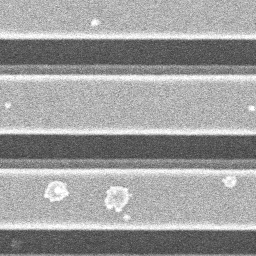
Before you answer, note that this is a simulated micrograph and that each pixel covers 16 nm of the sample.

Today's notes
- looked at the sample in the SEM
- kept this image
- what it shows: lines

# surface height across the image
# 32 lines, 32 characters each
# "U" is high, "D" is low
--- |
UUUUUUUUUUUUUUUUUUUUUUUUUUUUUUUU
UUUUUUUUUUUUUUUUUUUUUUUUUUUUUUUU
UUUUUUUUUUUUUUUUUUUUUUUUUUUUUUUU
UUUUUUUUUUUUUUUUUUUUUUUUUUUUUUUU
UUUUUUUUUUUUUUUUUUUUUUUUUUUUUUUU
DDDDDDDDDDDDDDDDDDDDDDDDDDDDDDDD
DDDDDDDDDDDDDDDDDDDDDDDDDDDDDDDD
DDDDDDDDDDDDDDDDDDDDDDDDDDDDDDDD
UUUUUUUUUUUUUUUUUUUUUUUUUUUUUUUU
UUUUUUUUUUUUUUUUUUUUUUUUUUUUUUUU
UUUUUUUUUUUUUUUUUUUUUUUUUUUUUUUU
UUUUUUUUUUUUUUUUUUUUUUUUUUUUUUUU
UUUUUUUUUUUUUUUUUUUUUUUUUUUUUUUU
UUUUUUUUUUUUUUUUUUUUUUUUUUUUUUUU
UUUUUUUUUUUUUUUUUUUUUUUUUUUUUUUU
UUUUUUUUUUUUUUUUUUUUUUUUUUUUUUUU
UUUUUUUUUUUUUUUUUUUUUUUUUUUUUUUU
DDDDDDDDDDDDDDDDDDDDDDDDDDDDDDDD
DDDDDDDDDDDDDDDDDDDDDDDDDDDDDDDD
DDDDDDDDDDDDDDDDDDDDDDDDDDDDDDDD
UUUUUUUUUUUUUUUUUUUUUUUUUUUUUUUU
UUUUUUUUUUUUUUUUUUUUUUUUUUUUUUUU
UUUUUUUUUUUUUUUUUUUUUUUUUUUUUUUU
UUUUUUUUUUUUUUUUUUUUUUUUUUUUUUUU
UUUUUUUUUUUUUUUUUUUUUUUUUUUUUUUU
UUUUUUUUUUUUUUUUUUUUUUUUUUUUUUUU
UUUUUUUUUUUUUUUUUUUUUUUUUUUUUUUU
UUUUUUUUUUUUUUUUUUUUUUUUUUUUUUUU
UUUUUUUUUUUUUUUUUUUUUUUUUUUUUUUU
DDDDDDDDDDDDDDDDDDDDDDDDDDDDDDDD
DDDDDDDDDDDDDDDDDDDDDDDDDDDDDDDD
DDDDDDDDDDDDDDDDDDDDDDDDDDDDDDDD